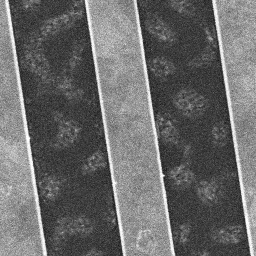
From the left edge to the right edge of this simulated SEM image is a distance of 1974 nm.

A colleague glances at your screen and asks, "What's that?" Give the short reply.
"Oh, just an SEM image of one or a few lines or trenches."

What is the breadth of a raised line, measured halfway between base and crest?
382 nm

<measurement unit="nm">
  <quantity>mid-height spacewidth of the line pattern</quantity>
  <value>595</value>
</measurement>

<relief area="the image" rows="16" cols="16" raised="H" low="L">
HLLLLHHHHLLLLHHH
HLLLLLHHHLLLLLHH
HLLLLLHHHLLLLLHH
HLLLLLHHHLLLLLHH
HLLLLLHHHLLLLLHH
HLLLLLHHHLLLLLHH
HLLLLLHHHLLLLLHH
HHLLLLHHHHLLLLHH
HHLLLLLHHHLLLLLH
HHLLLLLHHHLLLLLH
HHLLLLLHHHLLLLLH
HHLLLLLHHHLLLLLH
HHLLLLLHHHLLLLLH
HHLLLLLHHHHLLLLH
HHHLLLLLHHHLLLLL
HHHLLLLLHHHLLLLL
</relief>